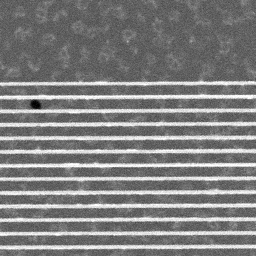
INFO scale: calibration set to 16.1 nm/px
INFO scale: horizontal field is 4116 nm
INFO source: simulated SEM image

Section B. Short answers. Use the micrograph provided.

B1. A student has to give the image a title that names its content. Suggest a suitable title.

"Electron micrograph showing parallel lines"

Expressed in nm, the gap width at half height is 175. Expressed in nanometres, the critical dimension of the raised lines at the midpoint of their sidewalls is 44.2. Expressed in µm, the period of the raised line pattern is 0.219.